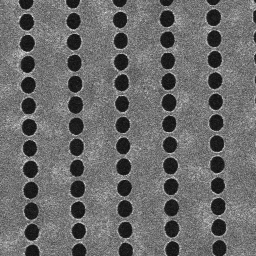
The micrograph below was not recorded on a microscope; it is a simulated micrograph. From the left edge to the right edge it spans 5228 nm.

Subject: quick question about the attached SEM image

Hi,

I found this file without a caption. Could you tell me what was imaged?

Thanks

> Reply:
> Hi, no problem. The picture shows a regular array of holes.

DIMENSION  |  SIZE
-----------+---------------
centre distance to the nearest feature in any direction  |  426 nanometres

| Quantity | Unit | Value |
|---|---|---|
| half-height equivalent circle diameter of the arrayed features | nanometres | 326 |